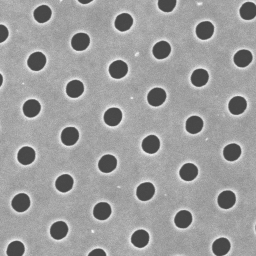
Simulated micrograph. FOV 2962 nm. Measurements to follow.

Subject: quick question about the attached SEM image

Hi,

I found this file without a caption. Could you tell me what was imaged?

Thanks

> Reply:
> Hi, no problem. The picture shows a regular array of holes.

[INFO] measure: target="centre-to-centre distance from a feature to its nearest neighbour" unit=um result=0.543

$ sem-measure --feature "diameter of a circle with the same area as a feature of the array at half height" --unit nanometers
215